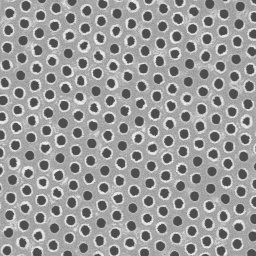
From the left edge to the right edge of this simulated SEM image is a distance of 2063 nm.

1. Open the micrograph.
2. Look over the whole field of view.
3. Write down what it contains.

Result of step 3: a regular array of holes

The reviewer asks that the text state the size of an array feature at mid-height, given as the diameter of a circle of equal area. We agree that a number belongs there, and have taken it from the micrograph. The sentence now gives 73.3 nm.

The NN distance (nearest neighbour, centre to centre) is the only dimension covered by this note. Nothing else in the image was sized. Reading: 138 nm